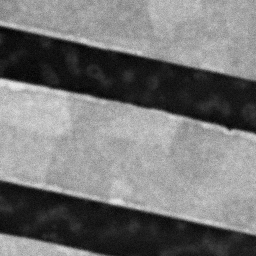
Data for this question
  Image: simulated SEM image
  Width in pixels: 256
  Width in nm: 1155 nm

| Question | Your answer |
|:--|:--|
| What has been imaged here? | one or a few lines or trenches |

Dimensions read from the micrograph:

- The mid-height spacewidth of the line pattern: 239 nm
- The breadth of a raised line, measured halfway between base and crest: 445 nanometers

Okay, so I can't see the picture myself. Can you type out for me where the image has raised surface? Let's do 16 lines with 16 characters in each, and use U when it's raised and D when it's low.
UUUUUUUUUUUUUUUU
UUUUUUUUUUUUUUUU
DDDDUUUUUUUUUUUU
DDDDDDDDDUUUUUUU
DDDDDDDDDDDDDDUU
UUUDDDDDDDDDDDDD
UUUUUUUUDDDDDDDD
UUUUUUUUUUUUDDDD
UUUUUUUUUUUUUUUU
UUUUUUUUUUUUUUUU
UUUUUUUUUUUUUUUU
DUUUUUUUUUUUUUUU
DDDDDDUUUUUUUUUU
DDDDDDDDDDUUUUUU
DDDDDDDDDDDDDDDU
UUUUDDDDDDDDDDDD